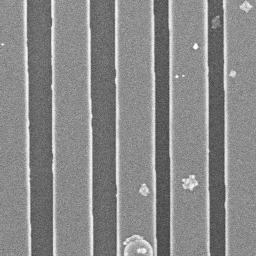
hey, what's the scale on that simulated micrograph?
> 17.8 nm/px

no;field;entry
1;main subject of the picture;lines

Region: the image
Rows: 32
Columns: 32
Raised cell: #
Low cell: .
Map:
###....####...#####..#####..####
###....####...#####..#####..####
###....####...#####..#####..####
###....####...#####..#####..####
###....####...#####..#####..####
###....####...#####..#####..####
###....####...#####..#####..####
###....####...#####..#####..####
###....####....####..#####..####
###....####....####..#####..####
###....####...#####..#####..####
###....####....####..#####..####
###....####....####..#####..####
###....####....####..#####..####
###....####....####..#####..####
###....####....####..#####..####
####...####....####..#####..####
####...####....####..#####..####
####...####....####..#####..####
####...####....####..#####..####
####...####....####..#####..####
####...####....####..#####..####
####...####....####..#####..####
####...####....####..#####..####
####...####....####..#####..####
####...####....####..#####..####
####...####....####..#####..####
####...#####...####..#####..####
####...#####...####..#####..####
####...#####...####..#####..####
####...#####...#####.#####..####
####...#####...#####.#####..####